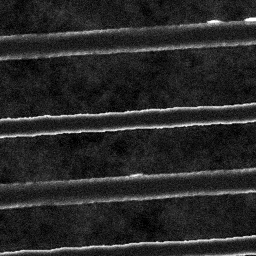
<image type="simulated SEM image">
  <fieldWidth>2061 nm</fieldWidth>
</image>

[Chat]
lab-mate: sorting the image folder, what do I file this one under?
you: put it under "lines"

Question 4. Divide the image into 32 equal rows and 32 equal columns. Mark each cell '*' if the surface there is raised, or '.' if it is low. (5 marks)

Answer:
................................
................................
...............................*
.....................***********
..******************************
******************************..
**************..................
................................
................................
................................
................................
................................
................................
.....................***********
.....***************************
***************************.....
***********.....................
................................
................................
................................
................................
..........................******
...........*********************
********************************
***********************.........
*****...........................
................................
................................
................................
...............................*
................****************
.*******************************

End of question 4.